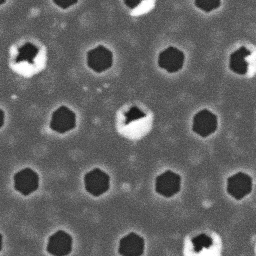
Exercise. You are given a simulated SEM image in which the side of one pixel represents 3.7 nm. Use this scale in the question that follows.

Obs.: a regular array of holes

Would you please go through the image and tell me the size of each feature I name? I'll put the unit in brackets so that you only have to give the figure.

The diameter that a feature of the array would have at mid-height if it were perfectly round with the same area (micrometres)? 0.0997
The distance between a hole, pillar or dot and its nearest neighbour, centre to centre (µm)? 0.259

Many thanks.